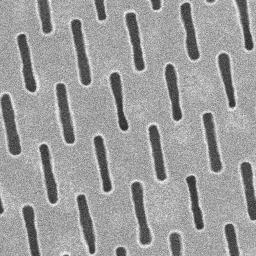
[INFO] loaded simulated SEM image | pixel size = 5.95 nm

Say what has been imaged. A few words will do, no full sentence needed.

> a regular array of holes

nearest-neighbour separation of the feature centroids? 0.329 micrometres